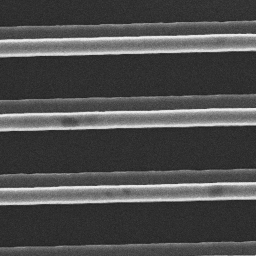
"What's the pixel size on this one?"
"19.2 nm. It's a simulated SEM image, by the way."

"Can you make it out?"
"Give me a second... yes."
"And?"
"lines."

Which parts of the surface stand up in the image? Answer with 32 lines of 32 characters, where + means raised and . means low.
................................
................................
................................
++++++++++++++++++++++++++++++++
++++++++++++++++++++++++++++++++
++++++++++++++++++++++++++++++++
+++++++++++++++++++++++.........
................................
................................
................................
................................
................................
...+++++++++++++++++++++++++++++
++++++++++++++++++++++++++++++++
++++++++++++++++++++++++++++++++
++++++++++++++++++++++++++++++++
................................
................................
................................
................................
................................
.....................+++++++++++
++++++++++++++++++++++++++++++++
++++++++++++++++++++++++++++++++
++++++++++++++++++++++++++++++++
+++++...........................
................................
................................
................................
................................
.....................+++++++++++
++++++++++++++++++++++++++++++++